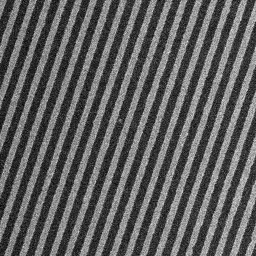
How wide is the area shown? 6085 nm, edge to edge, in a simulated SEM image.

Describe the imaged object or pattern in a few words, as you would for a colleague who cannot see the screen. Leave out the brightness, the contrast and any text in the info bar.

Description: parallel lines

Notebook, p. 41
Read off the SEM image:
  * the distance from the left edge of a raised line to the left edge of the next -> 339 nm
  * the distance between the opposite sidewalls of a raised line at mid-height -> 124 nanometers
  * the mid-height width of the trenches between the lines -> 211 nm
